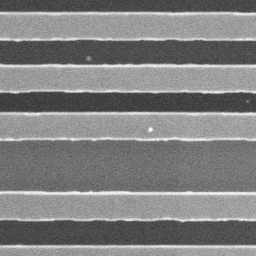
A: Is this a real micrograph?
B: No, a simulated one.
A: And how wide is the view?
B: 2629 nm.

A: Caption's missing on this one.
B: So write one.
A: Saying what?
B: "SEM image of lines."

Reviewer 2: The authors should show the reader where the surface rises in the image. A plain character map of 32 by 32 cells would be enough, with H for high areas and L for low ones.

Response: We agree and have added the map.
LLLLLLLLLLLLLLLLLLLLLLLLLLLLLLLL
LLLLLLLLLLLLLLLLLLLLLLLLLLLLLLLL
HHHHHHHHHHHHHHHHHHHHHHHHHHHHHHHH
HHHHHHHHHHHHHHHHHHHHHHHHHHHHHHHH
HHHHHHHHHHHHHHHHHHHHHHHHHHHHHHHH
LLLLLLLLLLLLLLLLLLLLLLLLLLLLLLLL
LLLLLLLLLLLLLLLLLLLLLLLLLLLLLLLL
LLLLLLLLLLLLLLLLLLLLLLLLLLLLLLLL
HHHHHHHHHHHHHHHHHHHHHHHHHHHHHHHH
HHHHHHHHHHHHHHHHHHHHHHHHHHHHHHHH
HHHHHHHHHHHHHHHHHHHHHHHHHHHHHHHH
LHHLLLLLLLLLLLLLLLLHLLLLLHHHLLLH
LLLLLLLLLLLLLLLLLLLLLLLLLLLLLLLL
LLLLLLLLLLLLLLLLLLLLLLLLLLLLLLLL
HHHHHHHHHHHHHHHHHHHHHHHHHHHHHHHH
HHHHHHHHHHHHHHHHHHHHHHHHHHHHHHHH
HHHHHHHHHHHHHHHHHHHHHHHHHHHHHHHH
LLLLLLLLLLLLLLLLLLLLLLLLLLLLLLLL
LLLLLLLLLLLLLLLLLLLLLLLLLLLLLLLL
LLLLLLLLLLLLLLLLLLLLLLLLLLLLLLLL
LLLLLLLLLLLLLLLLLLLLLLLLLLLLLLLL
LLLLLLLLLLLLLLLLLLLLLLLLLLLLLLLL
LLLLLLLLLLLLLLLLLLLLLLLLLLLLLLLL
LLLLLLLLLLLLLLLLLLLLLLLLLLLLLLLL
HHHHHHHHHHHHHHHHHHHHHHHHHHHHHHHH
HHHHHHHHHHHHHHHHHHHHHHHHHHHHHHHH
HHHHHHHHHHHHHHHHHHHHHHHHHHHHHHHH
LLHHHHHLLHHHLHHHHHHHLLHHHHHHHHHH
LLLLLLLLLLLLLLLLLLLLLLLLLLLLLLLL
LLLLLLLLLLLLLLLLLLLLLLLLLLLLLLLL
LLLLLLLLLLLLLLLLLLLLLLLLLLLLLLLL
HHHHHHHHHHHHHHHHHHHHHHHHHHHHHHHH